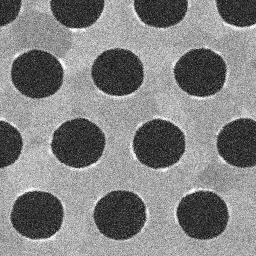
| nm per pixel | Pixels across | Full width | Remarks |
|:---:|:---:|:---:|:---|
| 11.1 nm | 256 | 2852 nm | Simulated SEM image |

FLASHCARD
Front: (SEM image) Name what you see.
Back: a regular array of holes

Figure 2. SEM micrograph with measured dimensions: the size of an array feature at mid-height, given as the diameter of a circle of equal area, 582 nm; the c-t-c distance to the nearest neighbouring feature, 900 nm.